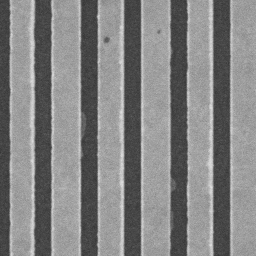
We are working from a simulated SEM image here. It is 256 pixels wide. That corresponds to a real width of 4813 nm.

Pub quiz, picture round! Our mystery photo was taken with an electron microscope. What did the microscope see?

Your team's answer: lines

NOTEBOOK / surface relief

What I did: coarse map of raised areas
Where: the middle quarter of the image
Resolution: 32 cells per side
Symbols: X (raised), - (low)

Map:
XXXX-----XXXXXX----XXXXXXX-----X
XXXX-----XXXXXX----XXXXXXXX----X
XXXX-----XXXXXX----XXXXXXX-----X
XXXX-----XXXXXX----XXXXXXX-----X
XXXX-----XXXXXX----XXXXXXX-----X
XXXX-----XXXXXX----XXXXXXX-----X
XXXX-----XXXXXX----XXXXXXX-----X
XXXX-----XXXXXX----XXXXXXX-----X
XXXX-----XXXXXX----XXXXXXX-----X
XXXX-----XXXXXX----XXXXXXX-----X
XXXX-----XXXXXX----XXXXXXX-----X
XXXX-----XXXXXX----XXXXXXX-----X
XXXX-----XXXXXX----XXXXXXX-----X
XXXX-----XXXXXX----XXXXXXXX----X
XXXX-----XXXXXX----XXXXXXX-----X
XXXX-----XXXXXX----XXXXXXX-----X
XXXX-----XXXXXX----XXXXXXX-----X
XXXX-----XXXXXX----XXXXXXX-----X
XXXX----XXXXXXX----XXXXXXX-----X
XXXX-----XXXXXX----XXXXXXX-----X
XXXX-----XXXXXX----XXXXXXXX----X
XXXX-----XXXXXX----XXXXXXX-----X
XXXX----XXXXXXX----XXXXXXXX----X
XXXX-----XXXXXX----XXXXXXXX----X
XXXX-----XXXXXX----XXXXXXXX----X
XXXX-----XXXXXX----XXXXXXXX----X
XXXX-----XXXXXX----XXXXXXX-----X
XXXX-----XXXXXX----XXXXXXX-----X
XXXX-----XXXXXX----XXXXXXX-----X
XXXX-----XXXXXX----XXXXXXX-----X
XXXX-----XXXXXX----XXXXXXX-----X
XXXX-----XXXXXX----XXXXXXX-----X